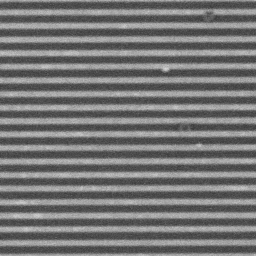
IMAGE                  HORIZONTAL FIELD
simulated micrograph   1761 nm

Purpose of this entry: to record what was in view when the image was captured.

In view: parallel lines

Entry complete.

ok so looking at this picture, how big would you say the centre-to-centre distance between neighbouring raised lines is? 93.2 nm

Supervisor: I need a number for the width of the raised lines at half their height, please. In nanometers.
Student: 31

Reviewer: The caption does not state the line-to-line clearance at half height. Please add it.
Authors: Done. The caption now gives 61.1 nanometres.